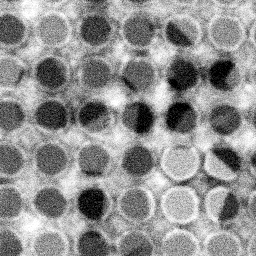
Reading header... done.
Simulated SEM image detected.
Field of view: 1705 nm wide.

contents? a regular array of raised bodies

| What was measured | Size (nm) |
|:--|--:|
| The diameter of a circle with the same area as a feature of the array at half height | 238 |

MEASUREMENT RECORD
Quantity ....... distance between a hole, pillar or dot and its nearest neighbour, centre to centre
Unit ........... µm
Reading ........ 0.285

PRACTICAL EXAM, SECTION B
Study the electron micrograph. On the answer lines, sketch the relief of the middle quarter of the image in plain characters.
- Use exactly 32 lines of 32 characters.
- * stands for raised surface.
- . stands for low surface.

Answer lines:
*...********...********...******
*...********..*********..*******
*...********..*********..*******
*...********..*********..*******
*...********...********...******
.....******....*******....******
.......***.......****......*****
................................
................................
.....****........***........***.
....*******....*******....******
*..********...*********..*******
*..*********..*********..*******
*..*********..*********..*******
*..*********..*********..*******
*...********..********....******
.....******....*******....******
......***........***........****
................................
................................
....******......*****......*****
*...*******....*******....******
*..*********..********...*******
*..*********..*********..*******
*..*********..*********.********
*..********...*********..*******
....*******...********...*******
.....*****.....******.....******
.......*.........**........****.
................................
................................
.....*****.....*****......*****.